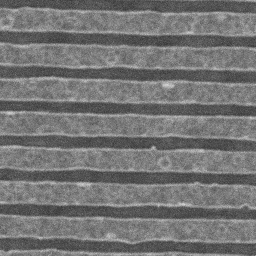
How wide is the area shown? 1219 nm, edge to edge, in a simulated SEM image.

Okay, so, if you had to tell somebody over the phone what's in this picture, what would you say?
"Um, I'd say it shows parallel lines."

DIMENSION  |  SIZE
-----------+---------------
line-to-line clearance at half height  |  61.3 nanometres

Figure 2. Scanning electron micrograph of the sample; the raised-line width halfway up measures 104 nm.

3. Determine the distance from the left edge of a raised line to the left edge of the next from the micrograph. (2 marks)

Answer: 164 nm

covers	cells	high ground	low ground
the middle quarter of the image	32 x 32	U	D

UUUUUUUUUUUUUUDUUUUUUUUUUUUUUUUU
DDDDDDDDDDDDDDDDDDDDDDDDDDDDDDDD
DDDDDDDDDDDDDDDDDDDDDDDDDDDDDDDD
DDDDDDDDDDDDDDDDDDDDDDDDDDDDDDDD
UUUUUUUUUUUUUUUUUUDDDDDUUUUUUUUU
DUUUUUUUUUUUUUUUUUUUUUUUUUUUUUUU
UUUUUUUUUUUUUUUUUUUUUUUUUUUUUUUU
UDDUUUUUUUUUUUUUUUUUUUUUUUUUUUUU
UUUUUUUUUUUUUUUUUUUUUUUUUUUUUUUU
DDDDDDDDDDDDDUUUUUUUUUUUUUUUUUUU
DDDDDDDDDDDDDDDDDDDDDDDDDDDDDDDD
DDDDDDDDDDDDDDDDDDDDDDDDDDDDDDDD
DUUDUUDDDDDDDDDDDDDDDDDDDDDDDDDD
UUUUUUUUUUUUUUUUUUUUUUUUUUUUUUUU
UUUUUUUUUUUUUUUUUUUUUUUUUUUUUUUU
UUUUUUUUUUUUUUUUUUUUUUUUUUUUUUUU
UUUUUUUUUUUUUUUUUUUUUUUUUUUUUUUU
UUUUUUUUUUUUUUUUUUUUUUUUUUUUUUUU
DDDDDDDDDDDDDDDDDDDDDDDDDDDDDDDD
DDDDDDDDDDDDDDDDDDDDDDDDDDDDDDDD
DDDDDDDDDDDDDDDDDDDDDDDDDDDDDDDD
DDUUUUUUUUUUUDDDUUUUUUUDDDDDDDDU
UUUUUUUUUUUUUUUUUUUUUUUUUUUUUUUU
UUUUUUUUUUUUUUUUUUUUUUUUUUUUUUUU
UUUUUUUUUUUUUUUUUUUUUUUUUUUUUUUU
UUUUUUUUUUUUUUUUUUUUUUUUUUUUUUUU
DDDDDDDDDUUUUUUUUUUUUUUUUUUUUUUU
DDDDDDDDDDDDDDDDDDDDDDDDDDDDDDDD
DDDDDDDDDDDDDDDDDDDDDDDDDDDDDDDD
DDDDDDDDDDDDDDDDDDDDDDDDDDDDDDDD
UUUUUUUUUUUUUUUUUUUUUUUUUUUUUUUU
UUUUUUUUUUUUUUUUUUUUUUUUUUUUUUUU